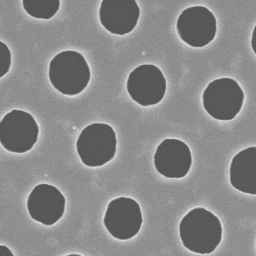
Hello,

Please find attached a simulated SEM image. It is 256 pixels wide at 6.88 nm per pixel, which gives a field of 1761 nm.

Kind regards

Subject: a regular array of holes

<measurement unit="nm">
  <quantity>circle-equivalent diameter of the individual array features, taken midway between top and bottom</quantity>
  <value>277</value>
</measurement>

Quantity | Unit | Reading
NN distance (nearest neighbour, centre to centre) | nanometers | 531